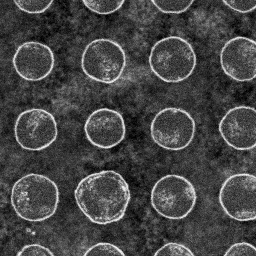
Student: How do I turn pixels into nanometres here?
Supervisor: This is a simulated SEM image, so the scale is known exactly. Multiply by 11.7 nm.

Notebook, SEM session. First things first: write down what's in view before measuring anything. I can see a regular array of raised bodies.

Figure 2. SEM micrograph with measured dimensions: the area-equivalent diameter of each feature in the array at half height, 0.502 micrometres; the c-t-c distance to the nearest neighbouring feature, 0.798 micrometres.